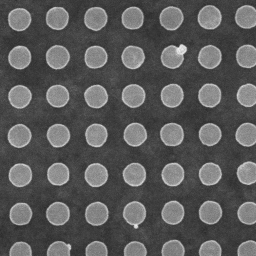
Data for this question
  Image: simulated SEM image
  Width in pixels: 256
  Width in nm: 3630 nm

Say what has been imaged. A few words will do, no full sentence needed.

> a regular array of raised bodies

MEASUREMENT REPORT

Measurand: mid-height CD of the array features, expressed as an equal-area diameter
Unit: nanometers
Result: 322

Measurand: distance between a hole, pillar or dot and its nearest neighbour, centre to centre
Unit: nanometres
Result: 535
